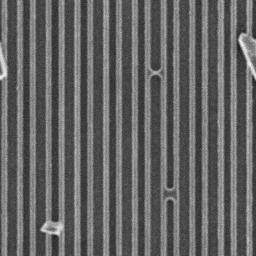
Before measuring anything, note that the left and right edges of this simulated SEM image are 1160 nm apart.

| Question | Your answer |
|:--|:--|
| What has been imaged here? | parallel lines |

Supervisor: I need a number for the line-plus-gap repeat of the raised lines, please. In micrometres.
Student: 0.0652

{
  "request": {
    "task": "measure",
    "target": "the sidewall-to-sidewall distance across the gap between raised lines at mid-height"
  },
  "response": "49.3 nm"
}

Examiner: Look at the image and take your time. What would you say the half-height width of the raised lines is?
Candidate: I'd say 22.1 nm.